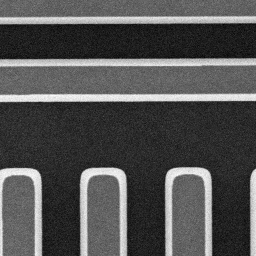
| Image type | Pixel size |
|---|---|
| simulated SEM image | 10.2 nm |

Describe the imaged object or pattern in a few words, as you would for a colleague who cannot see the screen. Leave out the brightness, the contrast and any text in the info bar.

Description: groups of lines, slits or small figures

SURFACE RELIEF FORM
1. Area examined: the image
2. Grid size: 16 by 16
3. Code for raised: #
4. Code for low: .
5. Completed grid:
################
................
................
................
################
################
................
................
................
................
................
##...###...##...
##...###...##...
##...###...##...
##...###...##...
##...###...##...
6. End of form